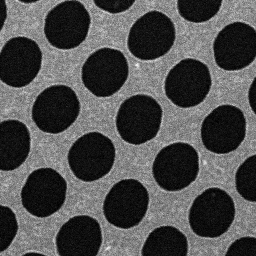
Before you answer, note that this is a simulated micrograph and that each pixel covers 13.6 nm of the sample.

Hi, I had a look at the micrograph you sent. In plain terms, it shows a regular array of holes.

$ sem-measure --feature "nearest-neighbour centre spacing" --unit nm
795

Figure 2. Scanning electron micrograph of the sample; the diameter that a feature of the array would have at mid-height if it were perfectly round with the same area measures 48.1 pixels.